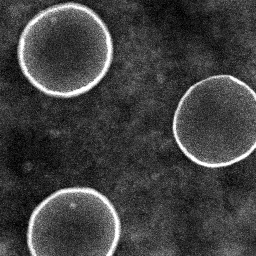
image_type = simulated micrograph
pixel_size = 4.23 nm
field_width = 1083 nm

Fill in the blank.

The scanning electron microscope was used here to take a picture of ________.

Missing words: raised bodies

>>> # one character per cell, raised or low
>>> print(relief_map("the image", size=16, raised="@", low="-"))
---@@-----------
--@@@@----------
-@@@@@@---------
-@@@@@@---------
--@@@@@---------
--@@@@-------@@-
-----------@@@@@
-----------@@@@@
-----------@@@@@
------------@@@@
----------------
----------------
---@@@@---------
--@@@@@---------
--@@@@@---------
--@@@@@---------